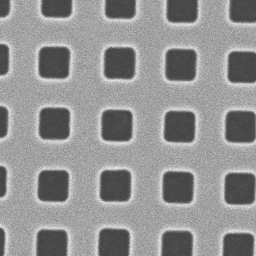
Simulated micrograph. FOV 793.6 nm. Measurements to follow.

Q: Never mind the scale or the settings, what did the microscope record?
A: a regular array of holes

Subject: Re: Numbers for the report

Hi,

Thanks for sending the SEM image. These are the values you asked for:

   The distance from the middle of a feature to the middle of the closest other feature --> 189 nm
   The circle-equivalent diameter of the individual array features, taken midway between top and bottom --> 0.106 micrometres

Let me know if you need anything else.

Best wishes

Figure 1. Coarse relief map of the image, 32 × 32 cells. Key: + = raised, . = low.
.++++....++++....++++....++++...
.++++....++++....++++....++++...
+++++++++++++++++++++...+++++...
++++++++++++++++++++++++++++++++
++++++++++++++++++++++++++++++++
++++++++++++++++++++++++++++++++
.++++....++++....++++...+++++...
.++++....++++....++++....+++....
.++++....++++....++++...++++....
+++++...+++++....++++...++++....
++++++++++++++++++++++++++++++++
++++++++++++++++++++++++++++++++
++++++++++++++++++++++++++++++++
.+++++..++++++++++++++++++++++++
.++++....++++....++++...++++....
.++++....++++....++++...++++....
.++++....++++....++++...++++....
++++++..+++++...+++++...++++....
++++++++++++++++++++++++++++++++
++++++++++++++++++++++++++++++++
++++++++++++++++++++++++++++++++
.++++...+++++...+++++..+++++++++
.++++....+++....++++....++++....
.++++....+++....++++....++++....
+++++....++++...++++....++++....
+++++++++++++++++++++++++++++..+
++++++++++++++++++++++++++++++++
++++++++++++++++++++++++++++++++
++++++++++++++++++++++++++++++++
.++++...++++....++++....++++....
.++++...++++....++++....++++....
++++....++++....++++....++++....